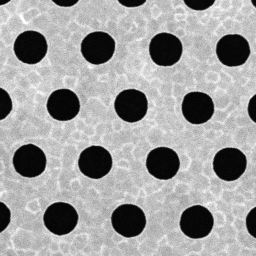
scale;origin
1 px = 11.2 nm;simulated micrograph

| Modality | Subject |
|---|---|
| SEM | a regular array of holes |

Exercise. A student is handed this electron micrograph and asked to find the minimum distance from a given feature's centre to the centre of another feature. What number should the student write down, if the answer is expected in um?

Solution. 0.739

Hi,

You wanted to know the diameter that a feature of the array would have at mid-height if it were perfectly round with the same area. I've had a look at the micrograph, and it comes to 384 nanometres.